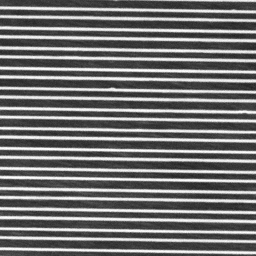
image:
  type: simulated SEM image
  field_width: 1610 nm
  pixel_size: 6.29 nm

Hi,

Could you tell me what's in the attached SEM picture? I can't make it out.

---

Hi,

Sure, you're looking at parallel lines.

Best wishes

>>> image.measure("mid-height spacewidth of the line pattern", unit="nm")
47.9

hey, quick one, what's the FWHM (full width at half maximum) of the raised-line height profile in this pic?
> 0.0157 micrometres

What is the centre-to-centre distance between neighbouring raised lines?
0.0631 µm